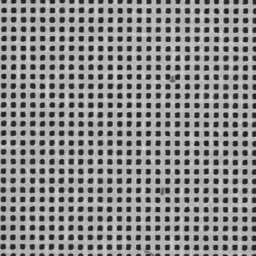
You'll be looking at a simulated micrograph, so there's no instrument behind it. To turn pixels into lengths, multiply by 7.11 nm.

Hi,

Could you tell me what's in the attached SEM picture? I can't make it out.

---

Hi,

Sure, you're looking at a regular array of holes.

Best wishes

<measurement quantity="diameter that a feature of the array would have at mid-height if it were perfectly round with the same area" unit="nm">43.2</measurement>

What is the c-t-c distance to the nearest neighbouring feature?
65.7 nanometers